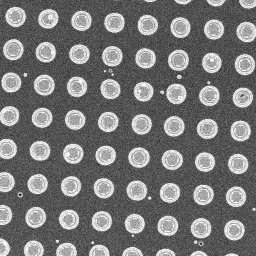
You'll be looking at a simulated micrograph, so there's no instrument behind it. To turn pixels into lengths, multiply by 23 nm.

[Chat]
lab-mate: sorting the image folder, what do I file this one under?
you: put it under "an array of small figures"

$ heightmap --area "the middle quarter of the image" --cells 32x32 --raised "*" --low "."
...................***.....****.
................................
................................
..**............................
.****.....***...................
.*****...*****....****.....***..
.*****...*****....****....****..
..***.....****....****....****..
...........**.....****....****..
...........................***..
................................
................................
.****.....**....................
*****....****.....***.....***...
*****....****....*****...*****..
.****....****....*****...*****..
..........**.....****....*****..
..........................***...
................................
................................
.***............................
*****...****.....***............
*****...*****...*****....****...
****....*****...*****....****...
.**......***....*****....*****..
..................**.....****...
................................
................................
.**.............................
****....****.....**.............
****....****....****.....***....
****....****....*****...*****...